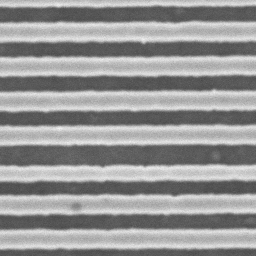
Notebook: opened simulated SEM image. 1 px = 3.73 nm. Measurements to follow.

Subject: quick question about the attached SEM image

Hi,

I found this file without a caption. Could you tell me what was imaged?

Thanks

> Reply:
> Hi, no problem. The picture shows parallel lines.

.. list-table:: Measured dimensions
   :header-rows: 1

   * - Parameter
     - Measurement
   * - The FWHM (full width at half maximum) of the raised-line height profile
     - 66.8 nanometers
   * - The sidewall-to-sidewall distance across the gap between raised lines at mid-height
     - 0.0607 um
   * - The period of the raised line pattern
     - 129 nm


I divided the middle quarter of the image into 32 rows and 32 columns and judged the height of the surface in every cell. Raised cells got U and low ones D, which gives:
UUUUUUUUUUUUUUUUUUUUUUUUUUUUUUUU
UUUUUUUUUUUUUUUUUUUUUUUUUUUUUUUU
UUUUUUUUUUUUUUUUUUUUUUUUUUUUUUUU
DDDDDDDDDDDDDDDDDDDDDDDDDDDDDDDD
DDDDDDDDDDDDDDDDDDDDDDDDDDDDDDDD
DDDDDDDDDDDDDDDDDDDDDDDDDDDDDDDD
DDDDDDDDDDDDDDDDDDDDDDDDDDDDDDDD
UUUUUUUUUUUUUUUUUUUUUUUUUUUUUUUU
UUUUUUUUUUUUUUUUUUUUUUUUUUUUUUUU
UUUUUUUUUUUUUUUUUUUUUUUUUUUUUUUU
UUUUUUUUUUUUUUUUUUUUUUUUUUUUUUUU
UDDDDDDDUDDDDDDDUUUDDDDDDDDDDDDD
DDDDDDDDDDDDDDDDDDDDDDDDDDDDDDDD
DDDDDDDDDDDDDDDDDDDDDDDDDDDDDDDD
DDDDDDDDDDDDDDDDDDDDDDDDDDDDDDDD
DDDDDDDDDDDDDDDDDDDDDDDDDDUUDUUU
UUUUUUUUUUUUUUUUUUUUUUUUUUUUUUUU
UUUUUUUUUUUUUUUUUUUUUUUUUUUUUUUU
UUUUUUUUUUUUUUUUUUUUUUUUUUUUUUUU
UUUUUUUUUUUUUUUUUUUUUUUUUUUUUUUU
DDDDDDDDDDDDDDDDDDDDDDDDDDDDDDDD
DDDDDDDDDDDDDDDDDDDDDDDDDDDDDDDD
DDDDDDDDDDDDDDDDDDDDDDDDDDDDDDDD
DDDDDDDDDDDDDDDDDDDDDDDDDDDDDDDD
DDDDDDDDDDDDDDDDDDDDDDDDDDDDDDDD
DDDDDDDDDDDDDDDDDDDDDDDDDDDDUUUU
UUUUUUUUUUUUUUUUUUUUUUUUUUUUUUUU
UUUUUUUUUUUUUUUUUUUUUUUUUUUUUUUU
UUUUUUUUUUUUUUUUUUUUUUUUUUUUUUUU
DDDDDDDDDDDDDDDDDDDDDDDDDDDDDDDD
DDDDDDDDDDDDDDDDDDDDDDDDDDDDDDDD
DDDDDDDDDDDDDDDDDDDDDDDDDDDDDDDD